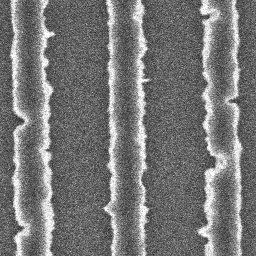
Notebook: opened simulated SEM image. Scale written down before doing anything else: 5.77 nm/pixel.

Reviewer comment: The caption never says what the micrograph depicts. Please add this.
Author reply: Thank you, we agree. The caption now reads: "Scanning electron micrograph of one or a few lines or trenches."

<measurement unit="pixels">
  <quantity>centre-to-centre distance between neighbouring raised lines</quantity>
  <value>95.6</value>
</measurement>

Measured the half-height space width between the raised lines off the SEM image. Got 371 nm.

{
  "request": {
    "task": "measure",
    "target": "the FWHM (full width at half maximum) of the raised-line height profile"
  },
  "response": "180 nanometers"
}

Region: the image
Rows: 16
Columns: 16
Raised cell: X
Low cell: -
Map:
-XX----XX----XX-
-XX----XX----XX-
-XX----XX----XX-
-XX----XX----XX-
-XX----XX----XX-
-XX----XX----XX-
-XX----XX----XX-
-XX----XX----XX-
-XX----XX----XX-
-XX----XX----XX-
-XX----XX----XX-
-XX----XX----XX-
-XX----XX----XX-
-XX----XX----XX-
-XX----XX----XX-
-XX----XX----XX-